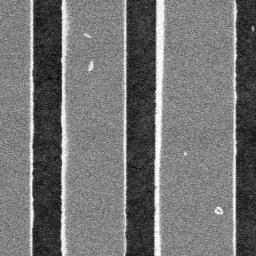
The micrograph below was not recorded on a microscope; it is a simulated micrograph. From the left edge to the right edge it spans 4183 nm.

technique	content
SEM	lines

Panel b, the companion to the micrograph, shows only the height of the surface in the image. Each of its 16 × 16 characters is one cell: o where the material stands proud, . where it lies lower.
oo..oooo..ooooo.
oo..oooo..ooooo.
oo..oooo..ooooo.
oo..oooo..ooooo.
oo..oooo..ooooo.
oo..oooo..ooooo.
oo..oooo..ooooo.
oo..oooo..ooooo.
oo..oooo..ooooo.
oo..oooo..ooooo.
oo..oooo..ooooo.
oo..oooo..ooooo.
oo..oooo..ooooo.
oo..oooo..ooooo.
oo..oooo..ooooo.
oo..oooo..ooooo.